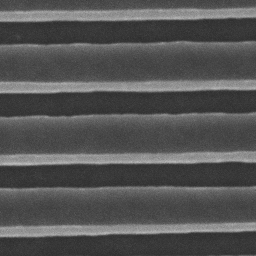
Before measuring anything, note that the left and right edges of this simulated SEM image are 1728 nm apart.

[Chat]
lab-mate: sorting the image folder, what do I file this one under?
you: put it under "lines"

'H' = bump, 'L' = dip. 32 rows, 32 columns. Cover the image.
HHHHHHHHHHHHHHHHHHHHHHHHHHHHHHHH
HHHHHHHHHHHHHHHHHHHHHHHHHHHHHHHH
HHHHHHHHHHHHHHHHLLLLLLLLLLLLLLLL
LLLLLLLLLLLLLLLLLLLLLLLLLLLLLLLL
LLLLLLLLLLLLLLLLLLLLLLLLLLLLLLLL
LLLLLLLLLHHLLLHHHHHHHHHHHHHHHHHH
HHHHHHHHHHHHHHHHHHHHHHHHHHHHHHHH
HHHHHHHHHHHHHHHHHHHHHHHHHHHHHHHH
HHHHHHHHHHHHHHHHHHHHHHHHHHHHHHHH
HHHHHHHHHHHHHHHHHHHHHHHHHHHHHHHH
HHHHHHHHHHHHHHHHHHHHHHHHHHHHHHHH
HHHHHHHLLLLLLLLLLLLLLLLLLLLLLLLL
LLLLLLLLLLLLLLLLLLLLLLLLLLLLLLLL
LLLLLLLLLLLLLLLLLLLLLLLLLLLLLLLL
LLLLLLLLLLLHHHHHHHHHHHHHHHHHHHHH
HHHHHHHHHHHHHHHHHHHHHHHHHHHHHHHH
HHHHHHHHHHHHHHHHHHHHHHHHHHHHHHHH
HHHHHHHHHHHHHHHHHHHHHHHHHHHHHHHH
HHHHHHHHHHHHHHHHHHHHHHHHHHHHHHHH
HHHHHHHHHHHHHHHHHHHHHHHHHHHHHHHH
HHHHLLLLLLLLLLLLLLLLLLLLLLLLLLLL
LLLLLLLLLLLLLLLLLLLLLLLLLLLLLLLL
LLLLLLLLLLLLLLLLLLLLLLLLLLLLLLLL
LLLLLLLLLLLLHHHHHHHHHHHHHHHHHHHH
HHHHHHHHHHHHHHHHHHHHHHHHHHHHHHHH
HHHHHHHHHHHHHHHHHHHHHHHHHHHHHHHH
HHHHHHHHHHHHHHHHHHHHHHHHHHHHHHHH
HHHHHHHHHHHHHHHHHHHHHHHHHHHHHHHH
HHHHHHHHHHHHHHHHHHHHHHHHHHHHHHHH
HHHHHLLLLLLLLLLLLLLLLLLLLLLLLLLL
LLLLLLLLLLLLLLLLLLLLLLLLLLLLLLLL
LLLLLLLLLLLLLLLLLLLLLLLLLLLLLLLL